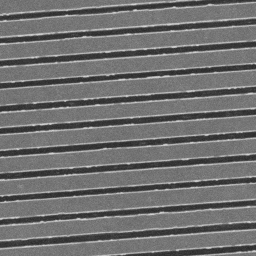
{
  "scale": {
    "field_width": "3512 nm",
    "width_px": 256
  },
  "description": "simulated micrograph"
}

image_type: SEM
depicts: parallel lines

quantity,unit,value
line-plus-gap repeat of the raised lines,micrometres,0.31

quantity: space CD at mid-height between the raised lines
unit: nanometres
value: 82.1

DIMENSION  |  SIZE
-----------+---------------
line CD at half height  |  221 nanometers